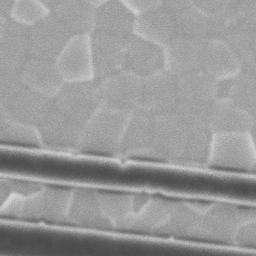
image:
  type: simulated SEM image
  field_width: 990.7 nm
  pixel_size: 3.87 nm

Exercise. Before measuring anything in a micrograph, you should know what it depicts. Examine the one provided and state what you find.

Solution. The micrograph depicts one or a few lines or trenches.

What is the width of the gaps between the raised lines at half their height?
44 px